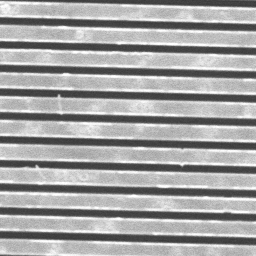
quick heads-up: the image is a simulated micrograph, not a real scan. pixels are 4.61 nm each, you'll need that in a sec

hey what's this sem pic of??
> parallel lines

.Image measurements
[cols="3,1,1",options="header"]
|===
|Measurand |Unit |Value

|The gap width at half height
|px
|7.14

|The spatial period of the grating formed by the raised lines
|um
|0.11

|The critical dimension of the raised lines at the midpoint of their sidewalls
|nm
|77.8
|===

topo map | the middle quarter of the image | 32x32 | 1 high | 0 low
00111111111111111111111111111111
00000000000000000000000000000000
11000000000000000000000000000000
11111111111111111111111111111111
11111111111111111111111111111111
11111111111111111111111111111111
00011111111111111111111111111111
00000000000000000000000000000000
11100000000000000000000000000000
11111111111111111111111111111111
11111111111111111111111111111111
11111111111111111111111111111111
00001111111111111111111111111111
00000000000000000000000000000000
11110000000000000000000000000000
11111111111111111111111111111111
11111111111111111111111111111111
11111111111111111111111111111111
00000111111111111111111111111111
00000000000000000000000000000000
11110000000000000000000000000000
11111111111111111111111111111111
11111111111111111111111111111111
11111111111111111111111111111111
00000111111111111111111111111111
00000000000000000000000000000000
11111000000000000000000000000000
11111111111111111111111111111111
11111111111111111111111111111111
11111111111111111111111111111111
00000000000000111111111111111111
00000000000000000000000000000000